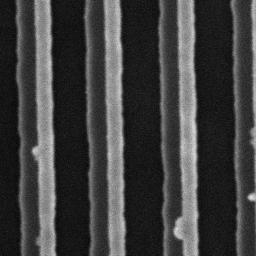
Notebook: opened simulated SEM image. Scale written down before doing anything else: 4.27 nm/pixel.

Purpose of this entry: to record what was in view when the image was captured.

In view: lines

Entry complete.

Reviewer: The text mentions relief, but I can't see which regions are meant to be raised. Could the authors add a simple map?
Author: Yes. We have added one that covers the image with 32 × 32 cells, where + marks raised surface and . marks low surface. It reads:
..++++.....++++.....++++.....+++
..++++.....++++.....++++.....+++
..++++.....++++.....++++.....+++
..++++.....++++.....++++.....+++
..++++.....++++.....++++.....+++
..++++.....++++.....++++.....+++
..++++.....++++.....++++.....+++
..++++.....++++.....++++.....+++
..++++.....++++.....++++.....+++
..++++.....++++.....++++.....+++
..++++.....++++.....++++.....+++
..++++.....++++.....++++.....+++
..+++++....++++.....++++.....+++
..+++++....++++.....++++.....+++
..++++.....++++.....++++......++
..++++.....++++.....++++......++
..+++++....++++.....++++......++
...++++....++++.....++++.....+++
...++++....++++.....++++.....+++
...++++....++++.....+++++....+++
...++++....++++.....++++.....+++
...++++....++++......++++.....++
...++++....++++......++++.....++
...++++....++++......++++.....++
...++++....++++......++++.....++
...++++....++++......++++.....++
...++++....++++.....+++++.....++
...++++....++++......++++.....++
...++++....+++++.....++++.....++
...++++....+++++.....++++.....++
...++++....+++++.....++++.....++
...++++....+++++.....++++.....++